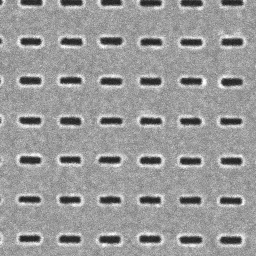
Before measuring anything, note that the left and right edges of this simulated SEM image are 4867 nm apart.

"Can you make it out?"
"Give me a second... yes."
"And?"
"a regular array of holes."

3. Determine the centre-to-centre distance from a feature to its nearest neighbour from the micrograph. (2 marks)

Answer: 749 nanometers